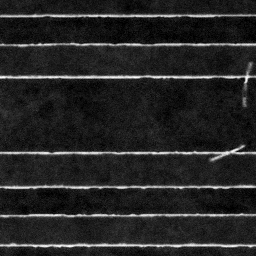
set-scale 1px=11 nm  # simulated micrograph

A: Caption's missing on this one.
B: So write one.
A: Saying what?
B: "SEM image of lines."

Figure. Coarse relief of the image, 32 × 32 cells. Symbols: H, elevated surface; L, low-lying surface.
HHHHHHHHHHHHHHHHHHHHHHHHHHHHHHHH
HHHHHHHHHHHHHHHHHHHHHHHHHHHHHHHH
LLLLLLLLLLLLLLLLLLLLLLLLLLLLLLLL
LLLLLLLLLLLLLLLLLLLLLLLLLLLLLLLL
LLLLLLLLLLLLLLLLLLLLLLLLLLLLLLLL
LLLLLLLLLLLLLLLLLLLLLLLLLLLLLLLL
HHHHHHHHHHHHHHHHHHHHHHHHHHHHHHHH
HHHHHHHHHHHHHHHHHHHHHHHHHHHHHHHH
HHHHHHHHHHHHHHHHHHHHHHHHHHHHHHHH
HHHHHHHHHHHHHHHHHHHHHHHHHHHHHHHH
LLLLLLLLLLLLLLLLLLLLLLLLLLLLLLLL
LLLLLLLLLLLLLLLLLLLLLLLLLLLLLLLL
LLLLLLLLLLLLLLLLLLLLLLLLLLLLLLLL
LLLLLLLLLLLLLLLLLLLLLLLLLLLLLLLL
LLLLLLLLLLLLLLLLLLLLLLLLLLLLLLLL
LLLLLLLLLLLLLLLLLLLLLLLLLLLLLLLL
LLLLLLLLLLLLLLLLLLLLLLLLLLLLLLLL
LLLLLLLLLLLLLLLLLLLLLLLLLLLLLLLL
LLLLLLLLLLLLLLLLLLLLLLLLLLLLLLLL
HHHHHHHHHHHHHHHHHHHHHHHHHHHHHHHH
HHHHHHHHHHHHHHHHHHHHHHHHHHHHHHHH
HHHHHHHHHHHHHHHHHHHHHHHHHHHHHHHH
HHHHHHHHHHHHHHHHHHHHHHHHHHHHHHHH
LLLLLLLLLLLLLLLLLLLLLLLLLLLLLLLL
LLLLLLLLLLLLLLLLLLLLLLLLLLLLLLLL
LLLLLLLLLLLLLLLLLLLLLLLLLLLLLLLL
LLLLLLLLLLLLLLLLLLLLLLLLLLLLLLLL
HHHHHHHHHHHHHHHHHHHHHHHHHHHHHHHH
HHHHHHHHHHHHHHHHHHHHHHHHHHHHHHHH
HHHHHHHHHHHHHHHHHHHHHHHHHHHHHHHH
HHHHHHHHHHHHHHHHHHHHHHHHHHHHHHHH
LLLLLLLLLLLLLLLLLLLLLLLLLLLLLLLL